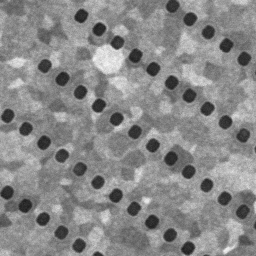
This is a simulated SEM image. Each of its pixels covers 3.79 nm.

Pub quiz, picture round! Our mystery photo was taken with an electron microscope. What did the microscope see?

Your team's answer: a regular array of holes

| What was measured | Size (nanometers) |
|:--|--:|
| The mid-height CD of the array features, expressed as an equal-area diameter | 55.1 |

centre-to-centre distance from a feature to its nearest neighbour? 22.2 px